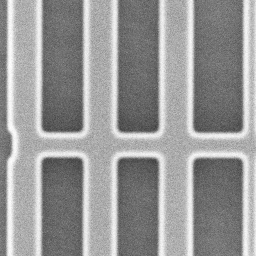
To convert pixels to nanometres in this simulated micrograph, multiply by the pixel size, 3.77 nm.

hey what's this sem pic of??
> groups of lines, slits or small figures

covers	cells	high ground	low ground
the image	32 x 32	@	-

-@@@@------@@@------@@@@-------@
-@@@@------@@@------@@@@-------@
-@@@@------@@@------@@@@-------@
-@@@@------@@@------@@@@-------@
-@@@@------@@@------@@@@-------@
-@@@@------@@@------@@@@-------@
-@@@@------@@@------@@@@-------@
-@@@@------@@@------@@@@-------@
-@@@@------@@@------@@@@-------@
-@@@@------@@@------@@@@-------@
-@@@@------@@@------@@@@-------@
-@@@@------@@@------@@@@-------@
-@@@@------@@@------@@@@-------@
-@@@@------@@@------@@@@-------@
-@@@@------@@@------@@@@-------@
-@@@@------@@@------@@@@-------@
-@@@@-----@@@@@-----@@@@------@@
--@@@@@@@@@@@@@@@@@@@@@@@@@@@@@@
--@@@@@@@@@@@@@@@@@@@@@@@@@@@@@@
--@@@@----@@@@@----@@@@@@----@@@
-@@@@------@@@------@@@@-------@
-@@@@------@@@------@@@@-------@
-@@@@------@@@------@@@@-------@
-@@@@------@@@------@@@@-------@
-@@@@------@@@------@@@@-------@
-@@@@------@@@------@@@@-------@
-@@@@------@@@------@@@@-------@
-@@@@------@@@------@@@@-------@
-@@@@------@@@------@@@@-------@
-@@@@------@@@------@@@@-------@
-@@@@------@@@------@@@@-------@
-@@@@------@@@------@@@@-------@